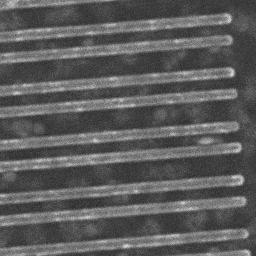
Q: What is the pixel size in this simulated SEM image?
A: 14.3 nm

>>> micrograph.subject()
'parallel lines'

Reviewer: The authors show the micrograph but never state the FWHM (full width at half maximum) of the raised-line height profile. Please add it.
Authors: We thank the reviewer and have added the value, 121 nm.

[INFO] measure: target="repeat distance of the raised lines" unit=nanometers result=384